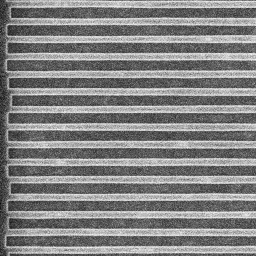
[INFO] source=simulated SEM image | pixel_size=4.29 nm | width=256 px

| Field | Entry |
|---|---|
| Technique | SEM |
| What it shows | parallel lines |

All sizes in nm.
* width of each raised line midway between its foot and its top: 29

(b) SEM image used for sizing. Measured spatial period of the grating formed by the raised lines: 75.2 nanometres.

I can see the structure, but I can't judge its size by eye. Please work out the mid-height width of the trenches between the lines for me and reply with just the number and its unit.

47.2 nanometers